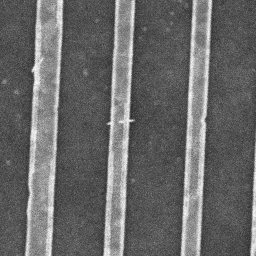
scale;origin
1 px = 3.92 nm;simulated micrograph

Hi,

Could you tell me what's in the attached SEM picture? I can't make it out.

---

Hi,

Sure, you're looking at one or a few lines or trenches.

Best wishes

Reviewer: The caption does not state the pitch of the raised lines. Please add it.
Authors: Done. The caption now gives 0.298 microns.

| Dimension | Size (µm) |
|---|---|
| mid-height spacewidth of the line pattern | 0.217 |